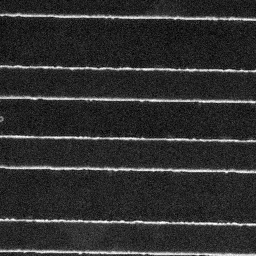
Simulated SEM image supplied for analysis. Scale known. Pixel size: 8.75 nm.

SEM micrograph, lines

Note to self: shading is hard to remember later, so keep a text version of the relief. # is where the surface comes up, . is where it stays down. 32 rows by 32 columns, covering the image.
################################
################################
................................
................................
................................
................................
................................
................................
########..#.....................
################################
################################
################################
.................###############
................................
................................
................................
................................
#########################.......
################################
################################
################################
............................####
................................
................................
................................
................................
................................
##..............................
################################
################################
################################
....############################